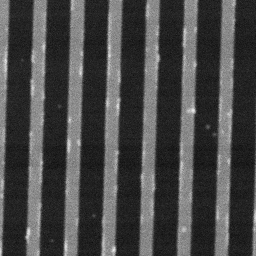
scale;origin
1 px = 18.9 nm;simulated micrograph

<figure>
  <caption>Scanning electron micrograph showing parallel lines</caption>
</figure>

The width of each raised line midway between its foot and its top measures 226 nm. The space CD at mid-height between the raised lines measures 481 nm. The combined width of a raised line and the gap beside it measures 0.711 µm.